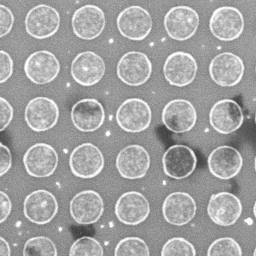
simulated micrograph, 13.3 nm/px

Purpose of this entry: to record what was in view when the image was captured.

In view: a regular array of raised bodies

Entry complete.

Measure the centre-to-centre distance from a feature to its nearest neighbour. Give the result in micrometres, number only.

0.611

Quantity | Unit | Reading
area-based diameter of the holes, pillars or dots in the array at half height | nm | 432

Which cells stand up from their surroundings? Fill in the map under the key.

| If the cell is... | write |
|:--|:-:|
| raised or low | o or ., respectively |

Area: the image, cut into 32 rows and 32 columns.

................................
o...ooo...ooo..ooo...ooo...ooo..
oo.oooo..oooo..oooo..oooo.oooo..
o..oooo..oooo..oooo..oooo.oooo..
....oo....oo....oo....oo...ooo..
................................
.....o..........................
o...ooo..oooo..ooo...ooo...ooo..
o..oooo..oooo..oooo..ooo..oooo..
o...ooo..oooo..oooo..ooo...ooo..
..........oo....o.....o....oo...
................................
o...oo..........o...............
o..oooo..oooo..oooo..ooo...ooo..
o..oooo..oooo..oooo.oooo..oooo..
o...ooo..oooo..oooo..ooo..oooo..
......................o.....o...
................................
o...oo....oo....oo...oo....oo...
o..oooo..oooo..ooo...ooo..oooo..
o..oooo..oooo..oooo.oooo..oooo..
o...oo...ooo...ooo...ooo...ooo..
................................
................................
o...ooo..ooo...ooo...ooo...oo...
o..oooo..oooo..oooo..ooo..oooo..
o..oooo..oooo..oooo..ooo..oooo..
....oo....oo...ooo...ooo...oo...
................................
................................
o..oooo..ooo...ooo...ooo...ooo..
o..oooo..oooo.ooooo.oooo..oooo..